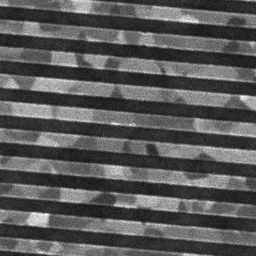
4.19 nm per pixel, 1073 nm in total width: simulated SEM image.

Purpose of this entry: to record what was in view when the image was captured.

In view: parallel lines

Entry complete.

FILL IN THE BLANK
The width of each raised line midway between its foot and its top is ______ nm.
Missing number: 52.1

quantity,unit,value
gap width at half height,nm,59.9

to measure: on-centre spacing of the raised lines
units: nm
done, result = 113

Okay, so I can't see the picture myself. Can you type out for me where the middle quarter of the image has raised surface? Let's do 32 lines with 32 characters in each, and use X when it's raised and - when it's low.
----XXXXXXXXXXXXXXXXXXXXXXXXXXXX
---------------XXXXXXXXXXXXXXXXX
--------------------------XXXXXX
--------------------------------
XXXX----------------------------
XXXXXXXXXXXXXXX-----------------
XXXXXXXXXXXXXXXXXXXXXXXXXX------
-----XXXXXXXXXXXXXXXXXXXXXXXXXXX
----------------XXXXXXXXXXXXXXXX
---------------------------XXXXX
--------------------------------
XXXXXXX-------------------------
XXXXXXXXXXXXXXXXXXX-------------
XXXXXXXXXXXXXXXXXXXXXXXXXXXXXX--
--------XXXXXXXXXXXXXXXXXXXXXXXX
-------------------XXXXXXXXXXXXX
-------------------------------X
--------------------------------
XXXXXXXX------------------------
XXXXXXXXXXXXXXXXXXXX------------
XXXXXXXXXXXXXXXXXXXXXXXXXXXXXXX-
---------XXXXXXXXXXXXXXXXXXXXXXX
--------------------XXXXXXXXXXXX
-------------------------------X
X-------------------------------
XXXXXXXXXXXX--------------------
XXXXXXXXXXXXXXXXXXXXXXX---------
-XXXXXXXXXXXXXXXXXXXXXXXXXXXXXXX
------------XXXXXXXXXXXXXXXXXXXX
------------------------XXXXXXXX
--------------------------------
XX-X----------------------------